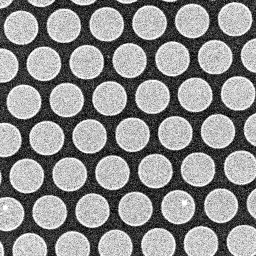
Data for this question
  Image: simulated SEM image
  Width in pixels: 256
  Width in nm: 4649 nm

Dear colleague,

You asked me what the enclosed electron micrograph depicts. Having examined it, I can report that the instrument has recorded an array of small figures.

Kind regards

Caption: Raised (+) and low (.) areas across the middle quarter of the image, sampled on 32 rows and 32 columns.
..++++++++..++++++++...++++++++.
..++++++++...+++++++....++++++..
...++++++.....+++++......++++...
....+++.........................
....................++++......++
+++......+++++.....++++++....+++
++++....+++++++...++++++++...+++
+++++..+++++++++..++++++++...+++
+++++..+++++++++..++++++++...+++
+++++..+++++++++..++++++++...+++
+++++...+++++++....+++++++....++
++++....+++++++.....+++++......+
+++.......+++...................
..........................++++..
....+++++.....++++++.....++++++.
...+++++++...++++++++...++++++++
...+++++++...++++++++...++++++++
..++++++++...++++++++...++++++++
..++++++++...++++++++...++++++++
..++++++++...++++++++...++++++++
...+++++++....++++++.....++++++.
....+++++......++++.............
................................
..........++++......+++++.....++
++++.....++++++....+++++++....++
+++++...++++++++...++++++++..+++
++++++..++++++++...++++++++..+++
++++++..++++++++...++++++++..+++
++++++..++++++++...++++++++...++
+++++...++++++++...+++++++.....+
++++.....++++++......++++.......
+++.............................